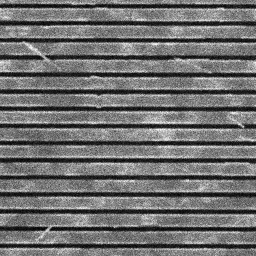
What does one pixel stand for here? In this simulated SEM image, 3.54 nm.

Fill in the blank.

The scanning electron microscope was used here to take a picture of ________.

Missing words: parallel lines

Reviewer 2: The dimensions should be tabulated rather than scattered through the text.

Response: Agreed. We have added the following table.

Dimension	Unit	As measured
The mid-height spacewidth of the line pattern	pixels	4.75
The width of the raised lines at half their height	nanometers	43.3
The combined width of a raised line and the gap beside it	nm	60.6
